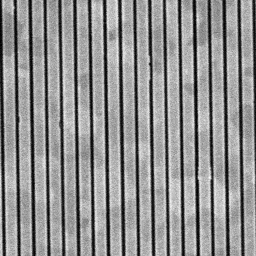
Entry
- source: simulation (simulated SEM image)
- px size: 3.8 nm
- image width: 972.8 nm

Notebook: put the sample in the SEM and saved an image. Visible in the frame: parallel lines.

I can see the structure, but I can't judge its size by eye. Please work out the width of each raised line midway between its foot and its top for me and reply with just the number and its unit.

39.9 nm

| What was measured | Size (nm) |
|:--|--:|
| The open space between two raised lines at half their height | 14.7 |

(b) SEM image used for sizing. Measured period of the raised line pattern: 56.7 nm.